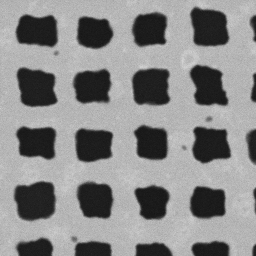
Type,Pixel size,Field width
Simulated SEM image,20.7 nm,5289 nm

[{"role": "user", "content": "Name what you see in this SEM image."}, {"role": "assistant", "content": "a regular array of holes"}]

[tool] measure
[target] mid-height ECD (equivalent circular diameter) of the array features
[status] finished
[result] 0.764 um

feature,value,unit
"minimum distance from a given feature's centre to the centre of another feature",1150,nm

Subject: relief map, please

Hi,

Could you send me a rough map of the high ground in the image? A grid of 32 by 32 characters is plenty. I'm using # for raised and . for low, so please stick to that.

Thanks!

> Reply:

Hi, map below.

################################
########################....####
##.....###...####....###....###.
##.....###....###....###....####
##.....###....###....###.....###
###....###...####...#####...####
################################
################################
########################..######
##.....###....###....###....####
##.....##.....###....###....####
###....##....####....###....###.
###....###...####....###....####
################################
################################
################################
##.....###....###....###....####
##.....##.....###....###....###.
##.....##.....###....###.....##.
###....###....####...###.....##.
################################
################################
################################
##.....###....###...####..######
##.....###....###....###....####
##.....###....###....###....####
##.....###....####...###....####
####.###########################
################################
################################
###...####....#####.#####...####
##....###.....###....###.....###